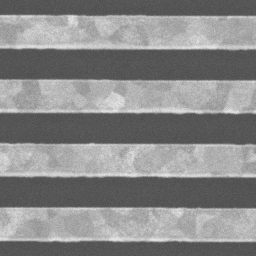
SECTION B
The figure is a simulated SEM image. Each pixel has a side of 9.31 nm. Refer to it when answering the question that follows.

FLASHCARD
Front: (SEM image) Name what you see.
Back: lines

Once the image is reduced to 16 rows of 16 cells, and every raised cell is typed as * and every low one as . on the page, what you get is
................
****************
****************
................
................
****************
****************
................
................
****************
****************
................
................
****************
****************
................